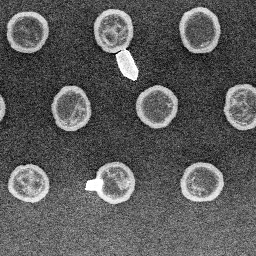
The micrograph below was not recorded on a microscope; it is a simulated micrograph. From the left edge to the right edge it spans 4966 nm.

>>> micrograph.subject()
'a regular array of raised bodies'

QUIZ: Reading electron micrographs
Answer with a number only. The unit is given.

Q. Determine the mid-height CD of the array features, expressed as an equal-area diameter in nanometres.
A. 738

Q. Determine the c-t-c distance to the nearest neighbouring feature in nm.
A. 1670